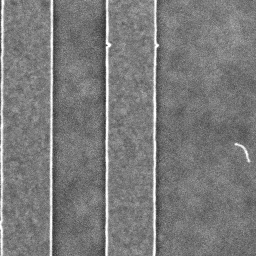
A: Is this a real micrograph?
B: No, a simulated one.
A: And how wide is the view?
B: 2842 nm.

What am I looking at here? one or a few lines or trenches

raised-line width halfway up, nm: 554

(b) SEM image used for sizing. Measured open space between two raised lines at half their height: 613 nanometres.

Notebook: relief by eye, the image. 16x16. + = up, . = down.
+++....+++......
+++....+++......
+++....+++......
+++....+++......
+++....+++......
+++....+++......
+++....+++......
+++....+++......
+++....+++......
+++....+++......
+++....+++......
+++....+++......
+++....+++......
+++....+++......
+++....+++......
+++....+++......